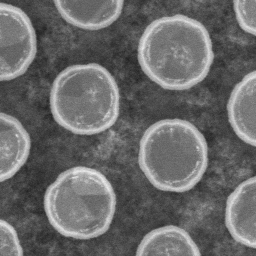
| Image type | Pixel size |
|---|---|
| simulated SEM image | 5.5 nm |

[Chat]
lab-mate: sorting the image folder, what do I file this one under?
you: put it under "raised bodies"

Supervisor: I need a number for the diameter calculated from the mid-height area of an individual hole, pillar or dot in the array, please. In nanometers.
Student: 372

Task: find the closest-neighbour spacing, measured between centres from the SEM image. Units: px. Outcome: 103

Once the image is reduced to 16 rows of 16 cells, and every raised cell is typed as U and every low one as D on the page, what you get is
UDDDUUUDDDDDDDDU
UUDDDUUDDDUUDDDU
UUDDDDDDDUUUUDDD
UUDDDDDDDUUUUDDD
UDDDUUUDDUUUUDDD
DDDUUUUDDDDDDDDU
DDDUUUUDDDDDDDUU
UDDDUUUDDDDDDDUU
UUDDDDDDDUUUDDDU
UUDDDDDDDUUUUDDD
UDDDDDDDDUUUUDDD
DDDUUUUDDDUUDDDU
DDDUUUUDDDDDDDUU
DDDUUUUDDDDDDDUU
UDDDUUDDDDUDDDDU
UDDDDDDDDUUUDDDD